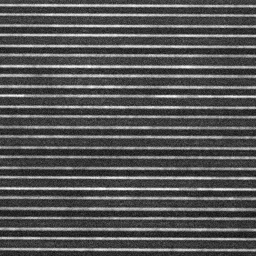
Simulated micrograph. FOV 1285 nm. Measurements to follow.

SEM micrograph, parallel lines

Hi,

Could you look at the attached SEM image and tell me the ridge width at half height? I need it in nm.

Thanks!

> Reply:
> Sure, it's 9.4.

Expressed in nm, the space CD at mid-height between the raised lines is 39.6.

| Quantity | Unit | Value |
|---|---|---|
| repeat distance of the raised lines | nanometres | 51.1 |